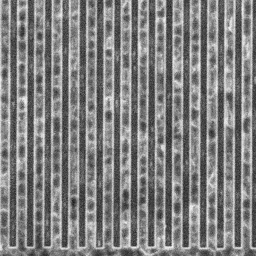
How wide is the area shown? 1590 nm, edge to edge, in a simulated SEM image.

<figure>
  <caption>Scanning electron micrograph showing parallel lines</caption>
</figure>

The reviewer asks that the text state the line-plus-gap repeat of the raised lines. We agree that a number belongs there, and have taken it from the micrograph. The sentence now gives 107 nanometers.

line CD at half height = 58.2 nanometers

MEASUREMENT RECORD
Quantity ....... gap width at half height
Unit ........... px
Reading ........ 7.62